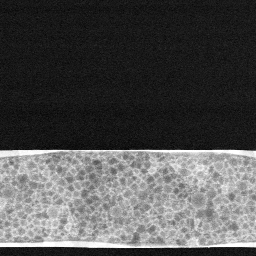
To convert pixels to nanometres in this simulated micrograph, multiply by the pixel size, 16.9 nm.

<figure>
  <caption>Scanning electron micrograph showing wiring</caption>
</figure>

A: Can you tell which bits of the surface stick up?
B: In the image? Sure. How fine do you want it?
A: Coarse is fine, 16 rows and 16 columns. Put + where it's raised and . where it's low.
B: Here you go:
................
................
................
................
................
................
................
................
................
..+++++++++++++.
++++++++++++++++
++++++++++++++++
++++++++++++++++
++++++++++++++++
++++++++++++++++
................